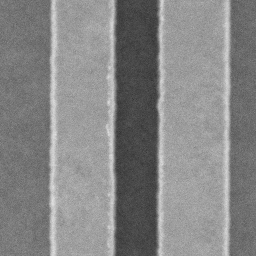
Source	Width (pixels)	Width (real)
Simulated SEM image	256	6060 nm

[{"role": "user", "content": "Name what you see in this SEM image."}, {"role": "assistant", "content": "one or a few lines or trenches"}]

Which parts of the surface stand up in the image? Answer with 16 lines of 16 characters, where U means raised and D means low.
DDDUUUUDDDUUUUDD
DDDUUUUDDDUUUUDD
DDDUUUUDDDUUUUDD
DDDUUUUDDDUUUUDD
DDDUUUUDDDUUUUDD
DDDUUUUDDDUUUUDD
DDDUUUUDDDUUUUDD
DDDUUUUDDDUUUUDD
DDDUUUUDDDUUUUDD
DDDUUUUDDDUUUUDD
DDDUUUUDDDUUUUDD
DDDUUUUDDDUUUUDD
DDDUUUUDDDUUUUDD
DDDUUUUDDDUUUUDD
DDDUUUUDDDUUUUDD
DDDUUUUDDDUUUUDD